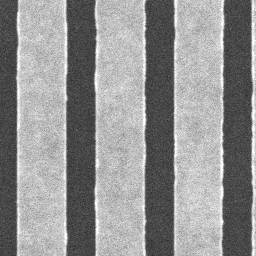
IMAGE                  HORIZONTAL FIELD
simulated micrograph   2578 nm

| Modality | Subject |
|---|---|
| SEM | lines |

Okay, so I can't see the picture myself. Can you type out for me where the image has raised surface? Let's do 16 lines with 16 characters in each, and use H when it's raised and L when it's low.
LHHHLLHHHLLHHHLL
LHHHLLHHHLLHHHLL
LHHHLLHHHLLHHHLL
LHHHLLHHHLLHHHLL
LHHHLLHHHLLHHHLL
LHHHLLHHHLLHHHLL
LHHHLLHHHLLHHHLL
LHHHLLHHHLLHHHLL
LHHHLLHHHLLHHHLL
LHHHLLHHHLLHHHLL
LHHHLLHHHLLHHHLL
LHHHLLHHHLLHHHLL
LHHHLLHHHLLHHHLL
LHHHLLHHHLLHHHLL
LHHHLLHHHLLHHHLL
LHHHLLHHHLLHHHLL